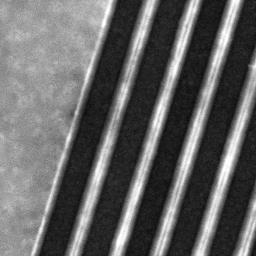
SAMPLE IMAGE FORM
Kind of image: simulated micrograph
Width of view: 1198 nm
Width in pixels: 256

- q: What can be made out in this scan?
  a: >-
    parallel lines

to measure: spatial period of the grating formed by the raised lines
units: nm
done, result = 189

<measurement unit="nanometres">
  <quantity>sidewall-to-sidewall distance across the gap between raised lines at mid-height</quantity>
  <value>134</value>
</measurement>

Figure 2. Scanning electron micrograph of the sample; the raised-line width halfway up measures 55.4 nanometres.